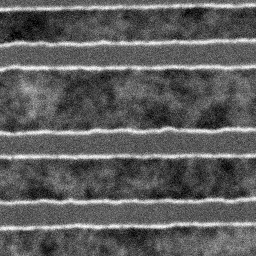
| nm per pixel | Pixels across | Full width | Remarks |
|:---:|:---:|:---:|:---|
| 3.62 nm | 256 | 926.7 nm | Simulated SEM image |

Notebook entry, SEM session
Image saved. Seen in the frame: lines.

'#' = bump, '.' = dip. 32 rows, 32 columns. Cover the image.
################################
................................
................................
................................
................................
.#####.#########################
################################
################################
#..#############.####..##..###..
................................
................................
................................
................................
................................
................................
................................
.....##....######.##############
################################
################################
#######################...######
................................
................................
................................
................................
................................
################################
################################
################################
#####...........................
................................
................................
................................